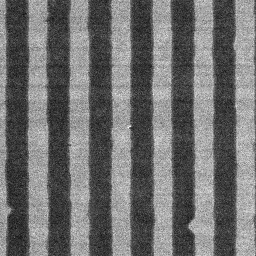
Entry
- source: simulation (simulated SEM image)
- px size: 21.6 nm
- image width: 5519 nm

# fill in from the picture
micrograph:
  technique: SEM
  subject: parallel lines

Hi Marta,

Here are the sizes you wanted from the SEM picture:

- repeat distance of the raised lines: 41.4 px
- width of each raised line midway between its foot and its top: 426 nanometers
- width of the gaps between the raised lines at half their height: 469 nm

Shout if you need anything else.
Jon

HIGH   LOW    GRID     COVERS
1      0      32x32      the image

10001100011000110001100011100111
10001100011000110001100011100111
10001100011000110001100011100111
10011100011000110001100011100111
10011100011000110001110011100111
10011100011000110001100011100111
10001100011000110001100011100111
10001100011000110001100011100111
10001100011000110001100011100111
10001100011000110001100011100111
10001100011000110001100011100111
10001100011000110001100011100111
10001100011000110001100011100111
10001100011000110001100011100111
10001100011000110001100011100011
10001100011000110001100011100011
10011100011000110001110011100011
10001100011000110001100011100011
10001100011000110001100011100011
10001100011000110001100011100011
10001100011000110001100011100011
10001100011000110001110011100011
10001100011000110001110011100011
10001100011000110001110011100011
10001100011000110001110011100011
10001100011000110001110011100011
10001100011000110001110011100011
10001100011000110001110011100011
10001100011000110001110011100011
10001100011000110001110011100111
10001100011000110001110011100111
10001100011000110001110011100111